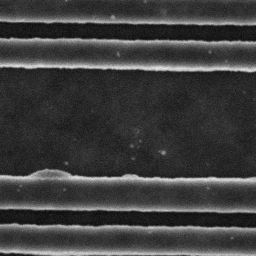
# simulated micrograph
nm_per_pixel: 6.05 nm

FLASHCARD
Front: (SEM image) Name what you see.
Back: lines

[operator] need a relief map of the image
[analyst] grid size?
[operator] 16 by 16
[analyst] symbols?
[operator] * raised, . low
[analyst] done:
****************
****************
****************
****************
................
................
................
................
................
................
................
****************
****************
****************
****************
****************